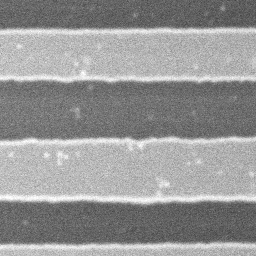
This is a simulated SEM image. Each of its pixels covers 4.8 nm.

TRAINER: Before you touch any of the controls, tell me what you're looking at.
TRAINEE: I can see lines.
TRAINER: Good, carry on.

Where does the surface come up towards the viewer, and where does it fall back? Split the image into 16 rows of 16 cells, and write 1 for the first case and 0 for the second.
0000000000000000
0000000000000000
1111111111111111
1111111111111111
1111111111111111
0000000000000000
0000000000000000
0000000000000000
0000000000000000
1111111111111111
1111111111111111
1111111111111111
0000001111110000
0000000000000000
0000000000000000
1111111111111111